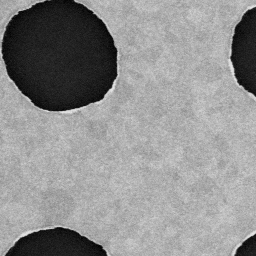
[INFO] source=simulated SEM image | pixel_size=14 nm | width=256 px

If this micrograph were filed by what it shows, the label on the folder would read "holes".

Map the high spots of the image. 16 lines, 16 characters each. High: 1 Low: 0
1100011111111111
1000000111111110
0000000111111100
0000000111111100
0000000111111110
1000000111111110
1100001111111111
1111111111111111
1111111111111111
1111111111111111
1111111111111111
1111111111111111
1111111111111111
1111111111111111
1100011111111111
1000001111111110